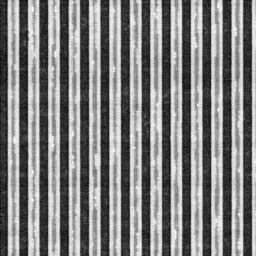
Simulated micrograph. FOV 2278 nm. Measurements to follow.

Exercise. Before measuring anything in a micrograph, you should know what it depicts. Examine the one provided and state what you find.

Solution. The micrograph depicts parallel lines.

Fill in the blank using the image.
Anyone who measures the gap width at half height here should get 107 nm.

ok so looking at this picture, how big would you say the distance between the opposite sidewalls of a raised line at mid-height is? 75.7 nm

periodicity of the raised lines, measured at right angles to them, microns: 0.181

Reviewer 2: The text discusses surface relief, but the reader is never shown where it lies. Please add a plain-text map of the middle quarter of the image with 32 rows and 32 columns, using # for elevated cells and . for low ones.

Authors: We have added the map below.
..##...##...##...##...##...##...
..##...##...##...##...##...##...
..##...##...##...##...##...##...
..##...##...##...##...##...##...
..##...##...##...##...##...##...
..##...##...##...##...##...##...
..##...##...##...##...##...##...
..##...#....##...##...##...##...
..##...##...##...##...##...##...
..##...##...##...##...##...##...
..##...##...##...##...##...##...
..##...##...##...##...##...##...
..##...##...##...##...##...##...
..##...##...##...##...##...##...
..##...##...##...##...##...##...
..##...##...##...##...##...##...
..##...##...##...##...##...##...
..##...##...##...##...##...##...
..##...##...##...##...##...##...
..##...##...##...##...##...##...
..##...##...##...##...##...##...
..##...##...##...##...##...##...
..##...##...##...##...##...##...
..##...##...##...##...##...##...
..##...##...##...##...##...##...
..##...##...##...##...##...##...
..##...#....##...##...##...##...
..##...##...##...##...##...##...
..##...##...##...##...##...##...
..##...##...##...##...##...##...
..#....##...##...##...##...##...
..##...##...##...##...##...##...